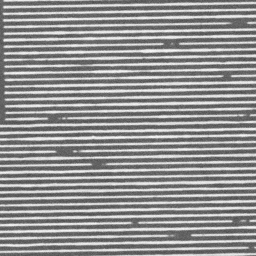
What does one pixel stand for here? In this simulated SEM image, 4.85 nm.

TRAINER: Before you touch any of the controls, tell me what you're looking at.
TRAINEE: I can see parallel lines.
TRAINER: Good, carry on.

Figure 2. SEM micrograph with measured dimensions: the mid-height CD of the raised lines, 0.0091 microns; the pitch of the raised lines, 0.032 microns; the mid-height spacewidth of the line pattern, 24.8 nanometers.